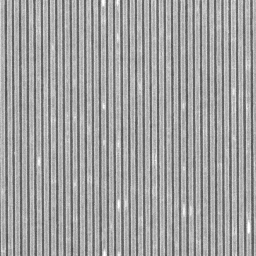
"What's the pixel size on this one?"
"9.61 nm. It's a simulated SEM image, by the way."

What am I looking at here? parallel lines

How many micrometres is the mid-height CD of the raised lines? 0.0397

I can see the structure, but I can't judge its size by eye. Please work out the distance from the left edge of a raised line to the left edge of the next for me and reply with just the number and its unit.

0.0695 um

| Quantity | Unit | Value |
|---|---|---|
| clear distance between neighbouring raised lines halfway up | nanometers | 26.4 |